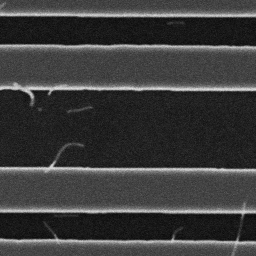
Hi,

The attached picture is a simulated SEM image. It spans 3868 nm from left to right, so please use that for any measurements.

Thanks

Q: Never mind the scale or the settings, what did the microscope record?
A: lines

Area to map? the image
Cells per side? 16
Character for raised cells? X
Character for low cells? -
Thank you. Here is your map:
XXXXXXXXXXXXXXXX
----------------
----------------
XXXXXXXXXXXXXXXX
XXXXXXXXXXXXXXXX
XXXXXXXXXXXXXXXX
----------------
----------------
----------------
----------------
XXXXXX----------
XXXXXXXXXXXXXXXX
XXXXXXXXXXXXXXXX
----------------
----------------
XXXXXXXXXXXXXXXX